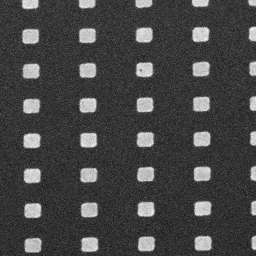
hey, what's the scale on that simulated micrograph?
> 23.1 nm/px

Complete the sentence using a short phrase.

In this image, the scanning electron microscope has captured a regular array of raised bodies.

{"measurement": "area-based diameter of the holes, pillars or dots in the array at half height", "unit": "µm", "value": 0.361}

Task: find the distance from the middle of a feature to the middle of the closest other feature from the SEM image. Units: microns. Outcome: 0.802